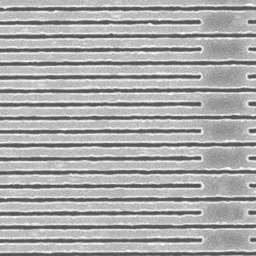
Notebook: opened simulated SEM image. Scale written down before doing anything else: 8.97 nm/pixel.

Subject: parallel lines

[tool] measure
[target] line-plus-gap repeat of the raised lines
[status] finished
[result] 122 nm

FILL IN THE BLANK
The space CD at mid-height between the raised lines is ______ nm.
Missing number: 33.6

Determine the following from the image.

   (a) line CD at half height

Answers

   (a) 85.2 nm